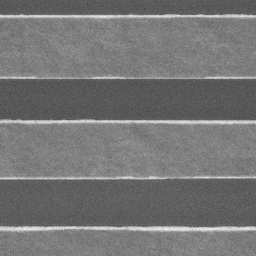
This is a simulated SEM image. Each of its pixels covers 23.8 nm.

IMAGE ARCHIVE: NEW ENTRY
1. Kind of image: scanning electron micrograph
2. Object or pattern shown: lines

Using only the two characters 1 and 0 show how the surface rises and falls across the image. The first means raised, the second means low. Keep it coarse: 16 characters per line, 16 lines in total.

0000000000000000
1111111111111111
1111111111111111
1111111111111111
1111111111111111
0000000000000000
0000000000000000
0000000000000000
1111111111111111
1111111111111111
1111111111111111
0000000000000000
0000000000000000
0000000000000000
1111111111111111
1111111111111111